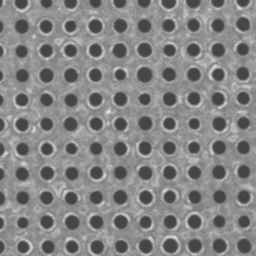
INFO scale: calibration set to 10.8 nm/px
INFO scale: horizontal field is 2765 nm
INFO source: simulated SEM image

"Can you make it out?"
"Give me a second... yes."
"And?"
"a regular array of holes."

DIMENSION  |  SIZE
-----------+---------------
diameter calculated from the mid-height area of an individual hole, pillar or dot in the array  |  146 nanometers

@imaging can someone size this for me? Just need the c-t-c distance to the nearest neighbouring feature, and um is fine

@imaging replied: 0.261